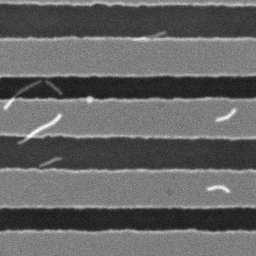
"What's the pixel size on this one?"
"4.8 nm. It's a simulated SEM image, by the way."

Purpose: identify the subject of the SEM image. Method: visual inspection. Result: lines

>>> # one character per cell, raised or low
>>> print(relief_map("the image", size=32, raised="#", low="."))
.....#######.###################
................................
................................
................................
................................
################################
################################
################################
################################
####################..#.####.##.
................................
................................
################################
################################
################################
################################
################################
................................
................................
................................
................................
################################
################################
################################
################################
################################
................................
................................
................................
################################
################################
################################